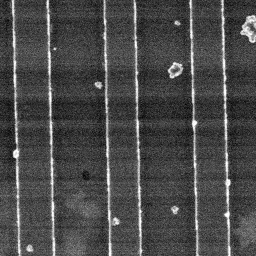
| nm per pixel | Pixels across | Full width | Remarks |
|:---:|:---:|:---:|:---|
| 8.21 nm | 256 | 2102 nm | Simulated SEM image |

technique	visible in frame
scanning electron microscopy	lines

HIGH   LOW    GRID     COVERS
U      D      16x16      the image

DUUDDDDUDDDDUUDD
DUUDDDDUDDDDUUDD
DUUDDDDUUDDDUUDD
DUUDDDDUUDDDUUDD
DUUDDDDUUDDDUUDD
DUUDDDDUUDDDUUDD
DUUDDDDUUDDDUUDD
DUUDDDDUUDDDUUDD
DUUDDDDUUDDDUUDD
DUUDDDDUUDDDUUDD
DUUDDDDUUDDDUUDD
DUUDDDDUUDDDUUDD
DUUDDDDUUDDDUUDD
DUUDDDDUUDDDUUDD
DUUDDDDUUDDDUUDD
DUUDDDDUUDDDUUDD